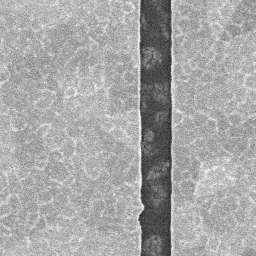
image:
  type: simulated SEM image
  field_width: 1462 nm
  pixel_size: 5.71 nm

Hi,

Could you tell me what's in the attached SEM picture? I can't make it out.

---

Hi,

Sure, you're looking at one or a few lines or trenches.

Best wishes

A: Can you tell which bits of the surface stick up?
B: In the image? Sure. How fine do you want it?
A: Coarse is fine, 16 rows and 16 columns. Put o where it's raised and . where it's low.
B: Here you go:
ooooooooo..ooooo
ooooooooo..ooooo
ooooooooo..ooooo
ooooooooo..ooooo
ooooooooo..ooooo
ooooooooo..ooooo
ooooooooo..ooooo
ooooooooo..ooooo
ooooooooo..ooooo
ooooooooo..ooooo
ooooooooo..ooooo
ooooooooo..ooooo
ooooooooo..ooooo
ooooooooo..ooooo
ooooooooo..ooooo
ooooooooo..ooooo